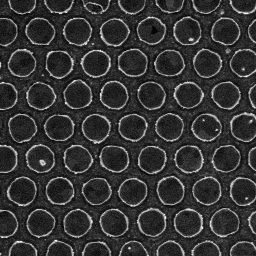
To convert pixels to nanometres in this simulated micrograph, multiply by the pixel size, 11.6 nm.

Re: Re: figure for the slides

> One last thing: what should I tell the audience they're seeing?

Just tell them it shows a regular array of raised bodies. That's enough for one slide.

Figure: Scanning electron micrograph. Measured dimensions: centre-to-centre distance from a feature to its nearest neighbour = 421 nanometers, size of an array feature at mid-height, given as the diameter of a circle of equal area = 325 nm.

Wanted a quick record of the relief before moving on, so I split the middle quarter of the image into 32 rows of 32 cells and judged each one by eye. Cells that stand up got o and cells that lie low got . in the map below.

oo..ooooooo...ooooooo..ooooooo..
oo...oooooo...oooooo...ooooooo..
o.....oooo.....ooooo....oooo....
................................
..ooo.......o...................
.ooooo....ooooo....ooooo....oooo
ooooooo...oooooo...oooooo...oooo
ooooooo..ooooooo...oooooo...oooo
ooooooo..ooooooo...oooooo...oooo
.oooooo..ooooooo...oooooo...oooo
.oooo......oooo.....oooo.....ooo
................................
..........................oo....
o.....oooo....oooooo....ooooo...
oo...oooooo...ooooooo..ooooooo..
oo...oooooo...ooooooo..ooooooo..
oo...oooooo...ooooooo..oooooo...
oo...oooooo...oooooo...oooooo...
o.....ooooo....oooo......oooo...
........o.......................
...o..........................oo
.ooooo....ooooo.....ooooo....ooo
ooooooo..ooooooo...oooooo...oooo
ooooooo..ooooooo...oooooo...oooo
ooooooo..ooooooo...oooooo...oooo
.ooooo....oooooo...oooooo...oooo
.ooooo.....oooo.....oooo.....ooo
................................
.........................ooo....
o.....ooooo....ooooo....ooooo...
oo...oooooo...ooooooo..ooooooo..
oo...ooooooo..ooooooo..ooooooo..